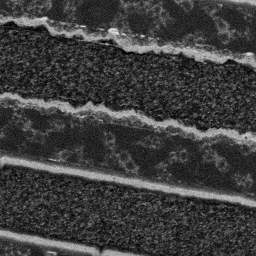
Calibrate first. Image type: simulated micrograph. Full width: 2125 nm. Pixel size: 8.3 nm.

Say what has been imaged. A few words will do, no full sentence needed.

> one or a few lines or trenches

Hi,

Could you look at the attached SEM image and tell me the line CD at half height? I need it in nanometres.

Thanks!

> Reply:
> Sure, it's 532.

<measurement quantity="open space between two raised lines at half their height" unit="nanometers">610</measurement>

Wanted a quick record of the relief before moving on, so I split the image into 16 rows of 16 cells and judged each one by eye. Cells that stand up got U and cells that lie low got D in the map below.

UUUUUUUUUUUUUUUU
DDDUUUUUUUUUUUUU
DDDDDDDUUUUUUUUU
DDDDDDDDDDDDDUUU
DDDDDDDDDDDDDDDD
DDDDDDDDDDDDDDDD
UUUUDDDDDDDDDDDD
UUUUUUUUUDDDDDDD
UUUUUUUUUUUUUUUD
UUUUUUUUUUUUUUUU
DDDUUUUUUUUUUUUU
DDDDDDDDDUUUUUUU
DDDDDDDDDDDDDDDU
DDDDDDDDDDDDDDDD
DDDDDDDDDDDDDDDD
UUUUUDDDDDDDDDDD